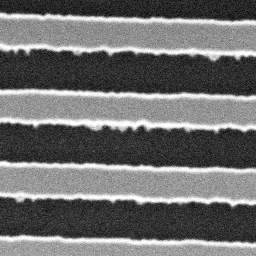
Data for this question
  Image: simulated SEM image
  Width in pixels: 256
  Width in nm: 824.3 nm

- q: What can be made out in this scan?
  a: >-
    lines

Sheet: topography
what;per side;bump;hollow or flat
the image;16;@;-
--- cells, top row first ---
----------------
@@@@@@@@@@@@@@@@
@@@@@@@@@@@@@@@@
----------------
----------------
----------------
@@@@@@@@@@@@@@@@
@@@@@@@@@@@@@@@@
----------------
----------------
@@@@@@@@@@@@-@--
@@@@@@@@@@@@@@@@
---------@@@@@@@
----------------
----------------
@@@@@@@@@@@@@@@@